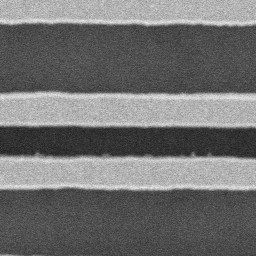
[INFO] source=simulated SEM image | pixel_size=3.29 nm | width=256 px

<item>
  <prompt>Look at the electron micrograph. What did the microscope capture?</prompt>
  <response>lines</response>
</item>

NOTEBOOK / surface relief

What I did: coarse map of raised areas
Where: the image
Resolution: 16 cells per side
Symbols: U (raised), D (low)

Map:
UUUUUUUUUUUUUUUU
DDDDDDDDDUDDDUUU
DDDDDDDDDDDDDDDD
DDDDDDDDDDDDDDDD
DDDDDDDDDDDDDDDD
DDDDDDDDDDDDDDDD
UUUUUUUUUUUUUUUU
UUUUUUUUUUUUUUUU
DDDDDDDDDDDDDDDD
DDDDDDDDDDDDDDDD
UUUUUUUUUUUUUUUU
UUUUUUUUUUUUUUUU
DDDDDDDDDDDDDDDD
DDDDDDDDDDDDDDDD
DDDDDDDDDDDDDDDD
DDDDDDDDDDDDDDDD